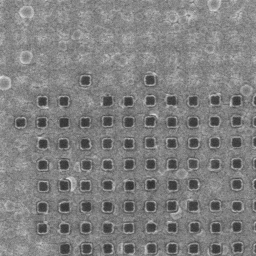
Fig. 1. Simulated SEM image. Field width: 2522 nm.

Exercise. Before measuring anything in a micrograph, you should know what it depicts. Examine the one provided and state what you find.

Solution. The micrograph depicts a regular array of raised bodies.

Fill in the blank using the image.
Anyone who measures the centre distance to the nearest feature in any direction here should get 206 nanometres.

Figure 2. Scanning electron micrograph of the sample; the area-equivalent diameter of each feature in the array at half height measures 0.117 um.